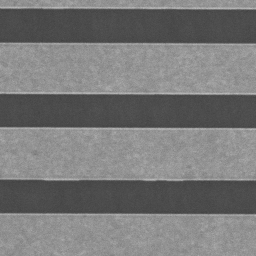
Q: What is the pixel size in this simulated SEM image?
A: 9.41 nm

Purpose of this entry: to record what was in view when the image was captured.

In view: one or a few lines or trenches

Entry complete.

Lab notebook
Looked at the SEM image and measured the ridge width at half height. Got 476 nm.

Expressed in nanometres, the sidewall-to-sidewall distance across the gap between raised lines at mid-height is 332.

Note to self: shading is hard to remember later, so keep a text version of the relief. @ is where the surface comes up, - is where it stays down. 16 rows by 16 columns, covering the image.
-------------@@@
----------------
----------------
@@@@@@@@@@@@@@@@
@@@@@@@@@@@@@@@@
@@@@@@@@@@@@@@@@
----------------
----------------
@@@@@@@@@@@@@@@@
@@@@@@@@@@@@@@@@
@@@@@@@@@@@@@@@@
----------------
----------------
@@@@@@@@@@@@@@@@
@@@@@@@@@@@@@@@@
@@@@@@@@@@@@@@@@